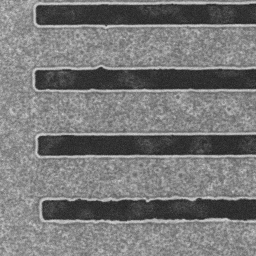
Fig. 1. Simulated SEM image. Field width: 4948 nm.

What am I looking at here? one or a few lines or trenches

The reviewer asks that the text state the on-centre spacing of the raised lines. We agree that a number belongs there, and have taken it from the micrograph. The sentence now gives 1260 nanometers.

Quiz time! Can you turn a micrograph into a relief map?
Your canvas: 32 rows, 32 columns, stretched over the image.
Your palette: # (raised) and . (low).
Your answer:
#####...........................
####............................
####............................
################################
################################
################################
################################
################################
#####....#....#.#.......##...##.
####............................
####............................
################################
################################
################################
################################
################################
################################
#####...........................
#####...........................
#####...........................
################################
################################
################################
################################
################################
#####...........................
#####...........................
######..........................
################################
################################
################################
################################